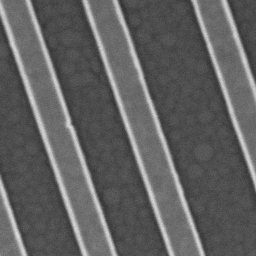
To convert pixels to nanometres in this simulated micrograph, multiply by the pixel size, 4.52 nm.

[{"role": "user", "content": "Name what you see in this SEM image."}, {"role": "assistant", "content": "one or a few lines or trenches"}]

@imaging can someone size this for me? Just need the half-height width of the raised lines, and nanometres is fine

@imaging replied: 130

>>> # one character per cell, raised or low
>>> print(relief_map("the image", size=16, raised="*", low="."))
**...**.....**..
**....**.....**.
.**...**.....**.
.**...**.....**.
.**....**.....**
..**...**.....**
..**...**.....**
..**....**.....*
...**...**.....*
...**...**.....*
...**....**.....
....**...**.....
....**....*.....
*...**....**....
*....**...**....
*....**....**...